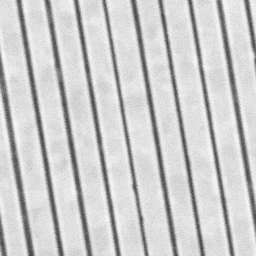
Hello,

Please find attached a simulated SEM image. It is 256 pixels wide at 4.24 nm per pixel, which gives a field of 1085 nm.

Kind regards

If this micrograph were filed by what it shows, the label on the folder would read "parallel lines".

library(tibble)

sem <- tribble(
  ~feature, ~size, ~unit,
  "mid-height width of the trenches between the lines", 30.3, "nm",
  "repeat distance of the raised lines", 28.2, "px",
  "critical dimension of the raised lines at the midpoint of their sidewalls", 91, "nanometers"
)